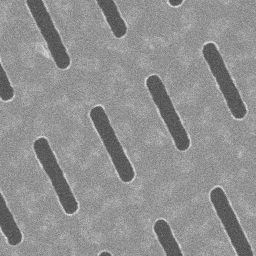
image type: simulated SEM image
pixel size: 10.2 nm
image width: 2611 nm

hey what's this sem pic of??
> holes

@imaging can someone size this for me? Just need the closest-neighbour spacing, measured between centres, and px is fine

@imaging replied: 64.5